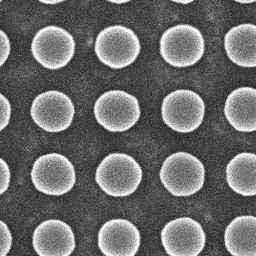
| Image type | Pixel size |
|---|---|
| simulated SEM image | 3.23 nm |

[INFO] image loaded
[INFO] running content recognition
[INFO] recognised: a regular array of raised bodies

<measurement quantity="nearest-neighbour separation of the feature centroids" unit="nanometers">206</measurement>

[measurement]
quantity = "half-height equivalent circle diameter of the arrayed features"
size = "42.5 pixels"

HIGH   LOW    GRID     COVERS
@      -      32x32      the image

--------------------------------
--------------------------------
--------------------------------
------@-------@@------@@-----@@@
@---@@@@@---@@@@@---@@@@@---@@@@
@---@@@@@---@@@@@---@@@@@---@@@@
@---@@@@@---@@@@@---@@@@@---@@@@
@----@@@@----@@@@----@@@@----@@@
--------------------------------
--------------------------------
--------------------------------
------@-------@-------@@-----@@@
@---@@@@@---@@@@@----@@@@---@@@@
@---@@@@@---@@@@@---@@@@@@--@@@@
@---@@@@@---@@@@@---@@@@@---@@@@
@----@@@@----@@@@----@@@@----@@@
--------------------------------
--------------------------------
--------------------------------
------@@------@@-----@@@------@@
@---@@@@@----@@@@---@@@@@----@@@
@---@@@@@---@@@@@@--@@@@@---@@@@
@---@@@@@---@@@@@@--@@@@@---@@@@
@----@@@@----@@@@----@@@@----@@@
--------------------------------
--------------------------------
--------------------------------
--------------@-------@@-----@@@
@----@@@@----@@@@----@@@@---@@@@
@---@@@@@---@@@@@---@@@@@@--@@@@
@---@@@@@---@@@@@---@@@@@@--@@@@
@----@@@@----@@@@----@@@@----@@@